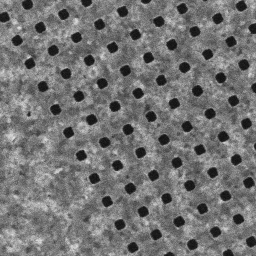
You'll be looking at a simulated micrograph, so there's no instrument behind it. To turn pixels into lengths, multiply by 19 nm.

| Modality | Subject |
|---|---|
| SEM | a regular array of holes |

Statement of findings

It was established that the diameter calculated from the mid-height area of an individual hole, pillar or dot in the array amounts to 11.6 pixels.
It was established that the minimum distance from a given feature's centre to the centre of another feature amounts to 500 nm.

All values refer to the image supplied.